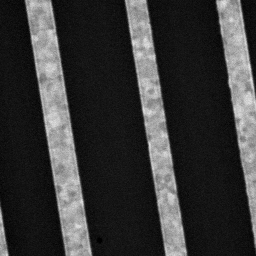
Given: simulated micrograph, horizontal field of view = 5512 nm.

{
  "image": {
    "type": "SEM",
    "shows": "one or a few lines or trenches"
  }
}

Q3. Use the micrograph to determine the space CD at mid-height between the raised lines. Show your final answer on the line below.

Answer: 1530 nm